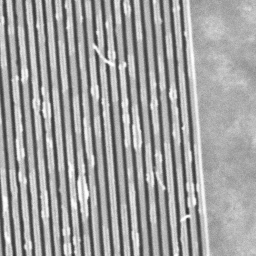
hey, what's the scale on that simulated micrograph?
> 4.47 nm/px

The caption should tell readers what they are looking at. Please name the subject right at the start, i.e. parallel lines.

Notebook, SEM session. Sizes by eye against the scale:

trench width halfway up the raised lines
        17.8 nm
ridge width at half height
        26.2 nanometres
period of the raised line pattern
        43.7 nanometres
